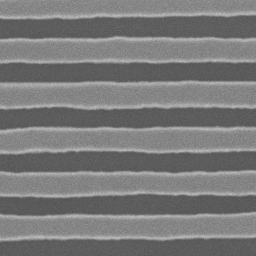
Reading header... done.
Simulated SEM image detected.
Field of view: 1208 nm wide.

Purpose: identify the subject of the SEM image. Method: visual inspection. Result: lines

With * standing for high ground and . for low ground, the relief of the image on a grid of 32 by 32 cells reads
********************************
********************************
................................
................................
................................
********************************
********************************
********************************
................................
................................
********************************
********************************
********************************
****.....*********..**.......*.*
................................
................................
********************************
********************************
********************************
................................
................................
*........****.*****.....**.*****
********************************
********************************
************....................
................................
................................
********************************
********************************
********************************
................................
................................